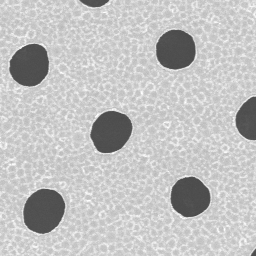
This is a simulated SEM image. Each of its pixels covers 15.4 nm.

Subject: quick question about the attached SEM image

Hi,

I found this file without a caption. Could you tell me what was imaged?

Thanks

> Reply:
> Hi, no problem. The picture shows holes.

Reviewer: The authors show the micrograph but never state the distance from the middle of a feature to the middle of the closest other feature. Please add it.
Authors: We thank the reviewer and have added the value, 1600 nm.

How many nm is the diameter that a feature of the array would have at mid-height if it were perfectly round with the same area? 638